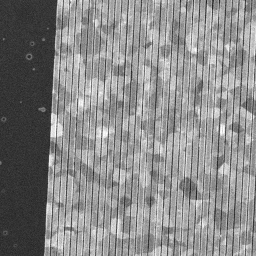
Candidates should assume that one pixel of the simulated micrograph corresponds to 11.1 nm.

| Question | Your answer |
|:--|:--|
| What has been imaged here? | parallel lines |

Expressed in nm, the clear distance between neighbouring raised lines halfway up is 16.6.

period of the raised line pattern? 71.8 nm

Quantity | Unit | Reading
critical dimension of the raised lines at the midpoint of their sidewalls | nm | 53.8